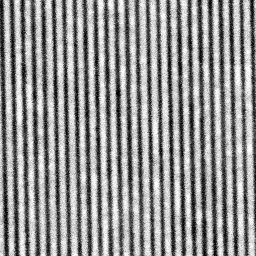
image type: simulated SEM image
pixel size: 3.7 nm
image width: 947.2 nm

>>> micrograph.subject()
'parallel lines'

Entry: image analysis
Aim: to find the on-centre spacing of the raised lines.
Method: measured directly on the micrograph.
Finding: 38.6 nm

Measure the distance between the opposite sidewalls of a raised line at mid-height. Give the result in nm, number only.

17.6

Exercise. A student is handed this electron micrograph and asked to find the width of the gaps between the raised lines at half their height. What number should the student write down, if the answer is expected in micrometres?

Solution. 0.0208